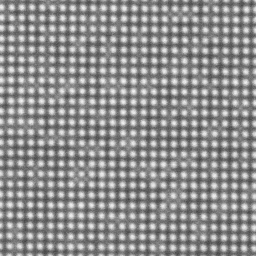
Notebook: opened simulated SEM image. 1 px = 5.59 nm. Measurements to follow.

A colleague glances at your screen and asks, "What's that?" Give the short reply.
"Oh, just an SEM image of a regular array of raised bodies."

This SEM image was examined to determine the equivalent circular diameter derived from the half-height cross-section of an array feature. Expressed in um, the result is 0.0321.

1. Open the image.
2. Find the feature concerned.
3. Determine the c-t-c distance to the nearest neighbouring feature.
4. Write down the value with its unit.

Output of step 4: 0.0562 micrometres